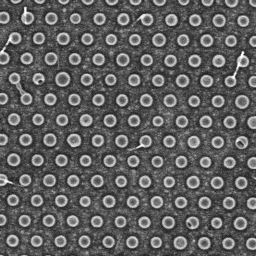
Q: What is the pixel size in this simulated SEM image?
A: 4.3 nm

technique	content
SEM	a regular array of raised bodies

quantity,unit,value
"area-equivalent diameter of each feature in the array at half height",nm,47.6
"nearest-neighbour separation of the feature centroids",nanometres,100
